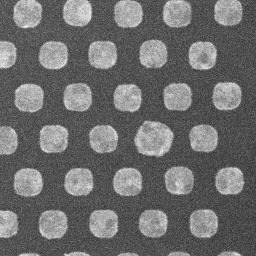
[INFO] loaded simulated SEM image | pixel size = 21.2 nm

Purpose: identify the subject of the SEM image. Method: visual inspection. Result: a regular array of raised bodies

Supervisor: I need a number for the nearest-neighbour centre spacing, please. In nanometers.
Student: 1020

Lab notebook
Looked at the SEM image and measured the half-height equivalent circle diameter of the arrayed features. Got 598 nanometres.